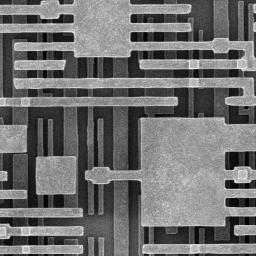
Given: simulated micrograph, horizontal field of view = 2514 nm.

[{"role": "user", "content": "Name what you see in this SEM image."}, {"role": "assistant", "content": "wiring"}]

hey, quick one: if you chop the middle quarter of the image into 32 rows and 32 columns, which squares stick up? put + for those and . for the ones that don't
...................+++++++++++++
................................
................................
....................+++...++++++
++++++++++++++++++++++++++++++++
++++++++++++++++++++++++++++++++
................................
................................
++++++++++++++++++++++++++++....
++++++++++++++++++++++++++++....
................................
................................
................................
...................+++++++++++++
...................+++++++++++++
...................+++++++++++++
...................+++++++++++++
...................+++++++++++++
...................+++++++++++++
...................+++++++++++++
...................+++++++++++++
...................+++++++++++++
...................+++++++++++++
+++................+++++++++++++
+++................+++++++++++++
+++................+++++++++++++
+++....+++++.......+++++++++++++
+++..+++++++++++++++++++++++++++
+++..+++++++++++++++++++++++++++
+++....+++++.......+++++++++++++
+++................+++++++++++++
+++................+++++++++++++